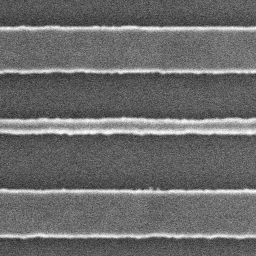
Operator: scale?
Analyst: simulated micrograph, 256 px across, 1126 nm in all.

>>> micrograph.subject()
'lines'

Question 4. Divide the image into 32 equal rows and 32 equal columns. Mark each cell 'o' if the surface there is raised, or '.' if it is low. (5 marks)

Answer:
................................
................................
................................
oooooooooooooooooooooooooooooooo
oooooooooooooooooooooooooooooooo
oooooooooooooooooooooooooooooooo
oooooooooooooooooooooooooooooooo
oooooooooooooooooooooooooooooooo
oooooooooooooooooooooooooooooooo
................................
................................
................................
................................
................................
................................
oooooooooooooooooooooooooooooooo
oooooooooooooooooooooooooooooooo
................................
................................
................................
................................
................................
................................
................................
oooooooooooooooooooooooooooooooo
oooooooooooooooooooooooooooooooo
oooooooooooooooooooooooooooooooo
oooooooooooooooooooooooooooooooo
oooooooooooooooooooooooooooooooo
ooooooooooooooooooo.oooooooooooo
................................
................................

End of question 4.